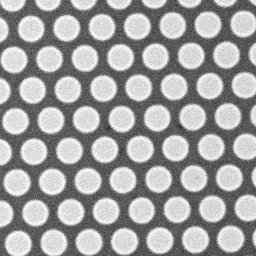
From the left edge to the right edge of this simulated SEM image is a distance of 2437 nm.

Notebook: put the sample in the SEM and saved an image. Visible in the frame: an array of small figures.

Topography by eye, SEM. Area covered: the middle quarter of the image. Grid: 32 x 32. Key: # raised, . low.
...#####....#####....####.....##
....#........##.................
................................
##......###......####....#####..
####...#####....#####....#####..
####...######...######..#######.
####...######...######...######.
####...######...#####....#####..
###.....####.....###......###...
................................
...............................#
....####....#####....#####....##
...#####....#####...######...###
..#######...#####...######...###
..#######...######..######...###
...#####....#####....#####....##
....###......###......##........
................................
.........##.......###.....####..
###.....#####...######...#####..
####...######...######...######.
####...######...######...######.
####...######...######...######.
####....####.....####.....####..
###.............................
................................
.....##......###......####....##
...######...#####....#####....##
...######...######...######..###
...######...######...######...##
...######...#####....#####....##
....####.....####.....###......#